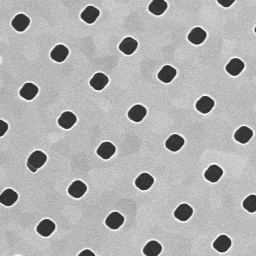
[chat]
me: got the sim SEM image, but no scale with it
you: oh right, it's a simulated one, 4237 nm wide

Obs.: a regular array of holes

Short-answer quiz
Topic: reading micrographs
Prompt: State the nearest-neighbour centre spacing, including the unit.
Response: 48.3 pixels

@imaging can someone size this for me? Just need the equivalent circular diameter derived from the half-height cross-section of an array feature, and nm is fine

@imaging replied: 295